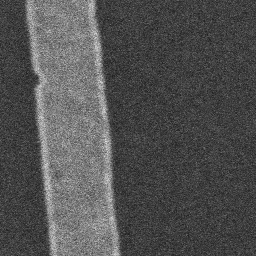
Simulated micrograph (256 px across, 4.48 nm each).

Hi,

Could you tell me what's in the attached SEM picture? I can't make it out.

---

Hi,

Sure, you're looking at one or a few lines or trenches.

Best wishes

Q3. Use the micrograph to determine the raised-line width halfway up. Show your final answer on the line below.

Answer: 62.9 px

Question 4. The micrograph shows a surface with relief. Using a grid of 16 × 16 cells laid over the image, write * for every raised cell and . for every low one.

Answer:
..****..........
..****..........
..****..........
..****..........
..****..........
..****..........
..****..........
...****.........
...****.........
...****.........
...****.........
...****.........
...****.........
...****.........
...****.........
...****.........